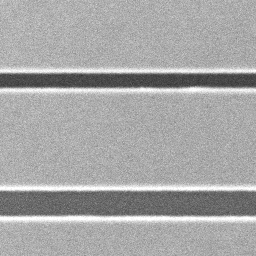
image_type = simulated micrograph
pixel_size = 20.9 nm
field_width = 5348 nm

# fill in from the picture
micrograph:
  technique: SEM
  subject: lines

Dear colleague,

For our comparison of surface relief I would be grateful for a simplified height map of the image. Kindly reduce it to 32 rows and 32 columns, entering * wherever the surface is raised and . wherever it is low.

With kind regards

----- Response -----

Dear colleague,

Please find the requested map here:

********************************
********************************
********************************
********************************
********************************
********************************
********************************
********************************
********************************
................................
................................
********************************
********************************
********************************
********************************
********************************
********************************
********************************
********************************
********************************
********************************
********************************
********************************
********************************
................................
................................
................................
********************************
********************************
********************************
********************************
********************************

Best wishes